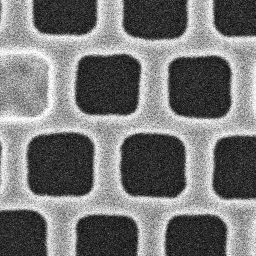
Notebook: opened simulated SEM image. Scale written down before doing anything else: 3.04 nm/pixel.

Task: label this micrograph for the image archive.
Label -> holes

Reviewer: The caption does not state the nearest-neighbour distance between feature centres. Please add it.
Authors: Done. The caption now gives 278 nm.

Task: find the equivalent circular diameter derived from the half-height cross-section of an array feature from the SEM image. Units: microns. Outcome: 0.213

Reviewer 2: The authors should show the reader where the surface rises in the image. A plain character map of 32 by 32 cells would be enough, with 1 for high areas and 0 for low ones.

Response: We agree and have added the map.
11110000000011100000000011100000
11110000000011100000000011100000
11110000000011100000000111100000
11110000000011100000000111100000
11111111101111110000000111110000
11111111111111111111111111111111
11111111111111111111111111111111
11111111110000000111110000001111
11111111110000000011100000000111
11111111100000000011100000000111
11111111100000000011100000000111
11111111100000000111100000000111
11111111100000000111100000000111
11111111110000000111100000000111
11111111111111111111111000001111
11111111111111111111111111111111
11111110001111111101111111111111
11110000000011110000000111100000
11100000000011100000000111100000
11100000000011100000000111100000
11100000000011100000000111100000
11100000000011100000000111100000
11100000000011100000000111000000
11110000000011100000000111000000
11111100000111111000001111100000
11111111111111111111111111111111
00000111111111111111111111111111
00000011110000000111100000001111
00000011100000000111100000001111
00000011100000000111100000001111
00000011100000000111100000001111
00000011100000000111100000001111